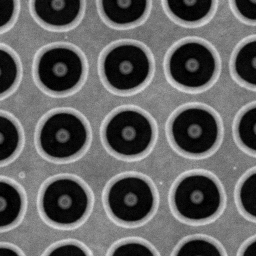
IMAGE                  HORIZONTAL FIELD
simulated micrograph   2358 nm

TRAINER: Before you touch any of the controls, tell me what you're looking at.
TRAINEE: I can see an array of small figures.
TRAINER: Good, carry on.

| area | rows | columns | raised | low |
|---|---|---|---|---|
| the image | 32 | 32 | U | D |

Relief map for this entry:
DDUUDDDUDDUUDDDUDDDUUDDDDDDUUDDD
DDUUDDDDDDUUUDDDDDUUUDDDDDUUUUDD
DDUUUDDDDDUUUDDDDDUUUUDDDDUUUUUD
DUUUUUUDUUUUUUUUUUUUUUUUUUUUUUUU
UUUUUUUUUUUUUUUUUUUUUUUUUUUUUUUU
UUUUUUUUUUUUUUUDDUUUUUDDDDUUUUDD
DUUUUDDDDDUUUDDDDDUUUDDDDDDUUDDD
DDUUUDDDDDUUUDDDDDDUUDDDDDDUUDDD
DDUUDDDUDDDUUDDUDDDUUDDDDDDUUDDD
DDUUUDDDDDUUUDDDDDDUUDDDDDDUUDDD
DDUUUDDDDDUUUDDDDDUUUUDDDDUUUUUD
DUUUUUDDDUUUUUUDUUUUUUUUUUUUUUUU
UUUUUUUUUUUUUUUUUUUUUUUUUUUUUUUU
UUUUUUUUUUUUUUUUUUUUUUUDDDUUUUUD
DUUUUUDDDDUUUUDDDDUUUUDDDDDUUUDD
DDUUUDDDDDDUUDDDDDDUUDDDDDDUUUDD
DDDUUDDDDDDUUDDDUDDUUDDDUDDDUDDD
DDDUUDDDDDDUUDDDDDDUUDDDDDDUUUDD
DDUUUDDDDDDUUUDDDDDUUUDDDDDUUUUD
DDUUUUDDDUUUUUUDDDUUUUUUDUUUUUUU
UUUUUUUUUUUUUUUUUUUUUUUUUUUUUUUU
UUUUUUUUUUUUUUUUUUUUUUUUUUUUUUUD
DUUUUUDDDDUUUUDDDDUUUUDDDDDUUUDD
DDUUUDDDDDDUUDDDDDDUUUDDDDDDUUDD
DDDUUDDDDDDUUDDDUDDUUUDDUDDDUUDD
UDDUUDDDUDDUUDDDDDDUUUDDDDDDUUDD
DDDUUDDDDDDUUUDDDDDUUUDDDDDUUUDD
DDUUUUDDDDUUUUUDDDUUUUUDDDUUUUUU
DUUUUUUUUUUUUUUUUUUUUUUUUUUUUUUU
UUUUUUUUUUUUUUUUUUUUUUUUUUUUUUUU
UUUUUUUUDDUUUUUDDDUUUUUDDDDUUUUD
DDUUUUDDDDDUUUDDDDDUUUDDDDDDUUDD